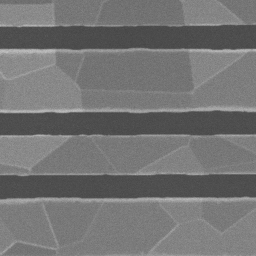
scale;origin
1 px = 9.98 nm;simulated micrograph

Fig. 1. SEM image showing lines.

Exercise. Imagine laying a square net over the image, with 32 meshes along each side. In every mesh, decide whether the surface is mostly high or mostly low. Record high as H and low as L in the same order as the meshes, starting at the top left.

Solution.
HHHHHHHHHHHHHHHHHHHHHHHHHHHHHHHH
HHHHHHHHHHHHHHHHHHHHHHHHHHHHHHHH
HHHHHHHHHHHHHHHHHHHHHHHHHHHHHHHH
LLLLLLLLLLLLLLLLLLLLLLLLLLLLLLLL
LLLLLLLLLLLLLLLLLLLLLLLLLLLLLLLL
LLLLLLLLLLLLLLLLLLLLLLLLLLLLLLLL
HHHHHHHHHHHHHHHHHHHHHHHHHHHHHHHH
HHHHHHHHHHHHHHHHHHHHHHHHHHHHHHHH
HHHHHHHHHHHHHHHHHHHHHHHHHHHHHHHH
HHHHHHHHHHHHHHHHHHHHHHHHHHHHHHHH
HHHHHHHHHHHHHHHHHHHHHHHHHHHHHHHH
HHHHHHHHHHHHHHHHHHHHHHHHHHHHHHHH
HHHHHHHHHHHHHHHHHHHHHHHHHHHHHHHH
HHHHHHHHHHHHHHHHHHHHHHHHHHHHHHHH
LLLLLLLLLLLLLLLLLLLLLLLLLLLLLLLL
LLLLLLLLLLLLLLLLLLLLLLLLLLLLLLLL
LLLLLLLLLLLLLLLLLLLLLLLLLLLLLLLL
HHHHHHHHHHHHHHHHHHHHHHHHHHHHHHHH
HHHHHHHHHHHHHHHHHHHHHHHHHHHHHHHH
HHHHHHHHHHHHHHHHHHHHHHHHHHHHHHHH
HHHHHHHHHHHHHHHHHHHHHHHHHHHHHHHH
HHHHHHHHHHHHHHHHHHHHHHHHHHHHHHHH
LLLLLLLLLLLLLLLLLLLLLLLLLLLLLLLL
LLLLLLLLLLLLLLLLLLLLLLLLLLLLLLLL
LLLLLLLLLLLLLLLLLLLLLLLLLLLLLLLL
HHHHHHHHHHHHHHHHHHHHHHHHHHHHHHHH
HHHHHHHHHHHHHHHHHHHHHHHHHHHHHHHH
HHHHHHHHHHHHHHHHHHHHHHHHHHHHHHHH
HHHHHHHHHHHHHHHHHHHHHHHHHHHHHHHH
HHHHHHHHHHHHHHHHHHHHHHHHHHHHHHHH
HHHHHHHHHHHHHHHHHHHHHHHHHHHHHHHH
HHHHHHHHHHHHHHHHHHHHHHHHHHHHHHHH